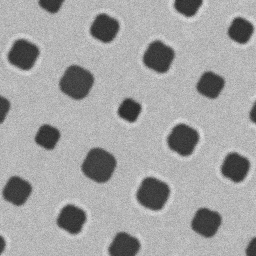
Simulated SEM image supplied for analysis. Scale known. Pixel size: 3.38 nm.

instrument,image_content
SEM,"a regular array of holes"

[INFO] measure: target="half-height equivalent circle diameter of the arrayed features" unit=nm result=99.7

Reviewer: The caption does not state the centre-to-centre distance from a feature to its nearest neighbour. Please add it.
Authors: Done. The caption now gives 202 nanometres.